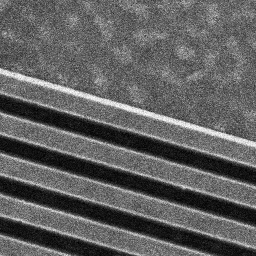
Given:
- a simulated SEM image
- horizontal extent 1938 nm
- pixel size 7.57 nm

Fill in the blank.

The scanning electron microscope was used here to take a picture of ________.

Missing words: parallel lines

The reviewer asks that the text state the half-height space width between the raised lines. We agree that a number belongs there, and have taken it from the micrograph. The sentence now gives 114 nanometres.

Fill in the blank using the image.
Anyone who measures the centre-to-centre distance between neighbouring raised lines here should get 296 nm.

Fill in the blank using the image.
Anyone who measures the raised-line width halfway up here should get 0.178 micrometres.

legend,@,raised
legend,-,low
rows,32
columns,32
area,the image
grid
--------------------------------
--------------------------------
--------------------------------
--------------------------------
--------------------------------
--------------------------------
--------------------------------
--------------------------------
--------------------------------
@@@-----------------------------
@@@@@@--------------------------
@@@@@@@@@-----------------------
--@@@@@@@@@@@-------------------
------@@@@@@@@@@----------------
@@-------@@@@@@@@@@@------------
@@@@@-------@@@@@@@@@@@---------
@@@@@@@@@-------@@@@@@@@@@@-----
--@@@@@@@@@@--------@@@@@@@@@@--
-----@@@@@@@@@@@-------@@@@@@@@@
@@-------@@@@@@@@@@--------@@@@@
@@@@@-------@@@@@@@@@@@-------@@
@@@@@@@@@-------@@@@@@@@@@------
-@@@@@@@@@@@-------@@@@@@@@@@@--
-----@@@@@@@@@@@-------@@@@@@@@@
@-------@@@@@@@@@@@-------@@@@@@
@@@@@-------@@@@@@@@@@-------@@@
@@@@@@@@-------@@@@@@@@@@@------
-@@@@@@@@@@@-------@@@@@@@@@@---
-----@@@@@@@@@@-------@@@@@@@@@@
@-------@@@@@@@@@@@-------@@@@@@
@@@@--------@@@@@@@@@@-------@@@
@@@@@@@@-------@@@@@@@@@@@------